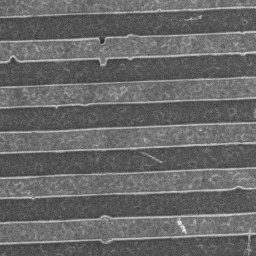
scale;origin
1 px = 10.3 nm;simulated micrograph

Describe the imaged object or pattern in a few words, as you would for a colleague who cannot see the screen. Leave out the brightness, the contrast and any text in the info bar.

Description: parallel lines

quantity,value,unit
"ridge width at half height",0.21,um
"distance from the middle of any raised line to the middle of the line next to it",467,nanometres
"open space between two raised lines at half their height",256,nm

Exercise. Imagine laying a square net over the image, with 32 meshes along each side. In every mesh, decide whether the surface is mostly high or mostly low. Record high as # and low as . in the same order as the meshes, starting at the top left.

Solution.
################################
###############.##..............
................................
................................
................#...############
################################
################################
#.####......#...................
................................
................................
...........#####################
################################
##########################......
................................
................................
............................####
.....###########################
################################
################................
................................
................................
....................############
################################
##############################.#
#######.........................
................................
................................
...........#####################
################################
########################........
................................
................................